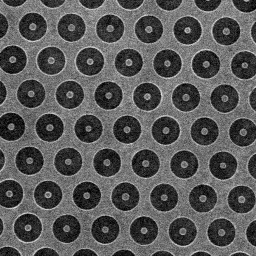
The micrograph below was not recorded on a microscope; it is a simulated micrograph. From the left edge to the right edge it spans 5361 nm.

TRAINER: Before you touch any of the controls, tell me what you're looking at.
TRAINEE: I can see an array of small figures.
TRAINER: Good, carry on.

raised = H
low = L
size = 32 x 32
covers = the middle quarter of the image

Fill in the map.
HHHLLLLLLLHHHLLLLLLLHHLLLLLLLHHH
HHHHLLLLLHHHHLLLLLLHHHHLLLLLLHHH
HHHHLLLLHHHHHHLLLLHHHHHLLLLLHHHH
HHHHHHHHHHHHHHHHHHHHHHHHHLHHHHHH
LLLHHHHHHHLLHHHHHHHHHHHHHHHHHHHH
LLLLHHHHHLLLLLHHHHLLLLLHHHHHLLLL
LLLLLHHHLLLLLLHHHHLLLLLLHHHLLLLL
LHLLLHHHLLLHLLLHHLLLLLLLHHHLLLLL
LLLLLHHLLLLLLLLHHLLLHLLLHHHLLLHL
LLLLLHHHLLLLLLHHHHLLLLLLHHHLLLLL
LLLLHHHHHLLLLLHHHHLLLLLLHHHHLLLL
HHHHHHHHHHLLHHHHHHHLLLHHHHHHHLLL
HHHHHHHHHHHHHHHHHHHHHHHHHHHHHHHH
HHHHLLLLLHHHHHLLLLHHHHHHLLLHHHHH
HHHLLLLLLHHHHLLLLLLHHHHLLLLLHHHH
HHHLLLLLLLHHLLLLLLLHHHLLLLLLLHHH
HHLLLLHLLLHHLLLHLLLLHHLLLHLLLHHH
HHHLLLLLLHHHLLLLLLLHHHLLLLLLLHHH
HHHLLLLLLHHHHLLLLLLHHHLLLLLLLHHH
HHHHHLLHHHHHHHLLLLHHHHHLLLLLHHHH
HHHHHHHHHHHHHHHHHHHHHHHHHHHHHHHH
LLLHHHHHHLLLHHHHHHHLLHHHHHHHHHLH
LLLLHHHHLLLLLLHHHHLLLLLHHHHHLLLL
LLLLLHHLLLLLLLHHHLLLLLLLHHHLLLLL
HHLLLHHLLLHLLLHHHLLLHLLLHHLLLLLL
LLLLLHHLLLLLLLHHHLLLHLLLHHLLLLHL
LLLLHHHHLLLLLLHHHLLLLLLLHHHLLLLL
LLLHHHHHLLLLLHHHHHLLLLLHHHHLLLLL
HHHHHHHHHHHHHHHHHHHHLHHHHHHHHLLH
HHHHHLLHHHHHHHHLHHHHHHHHHHHHHHHH
HHHLLLLLHHHHHLLLLLHHHHHLLLLHHHHH
HHLLLLLLLHHHLLLLLLLHHHLLLLLLHHHH